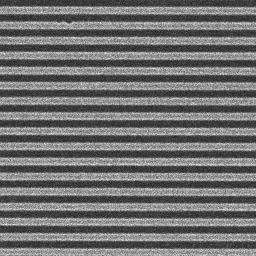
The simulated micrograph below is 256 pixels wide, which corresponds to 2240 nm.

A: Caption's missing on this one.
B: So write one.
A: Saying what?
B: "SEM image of parallel lines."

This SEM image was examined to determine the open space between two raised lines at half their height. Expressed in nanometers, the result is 59.1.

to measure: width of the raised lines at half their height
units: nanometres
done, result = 66.7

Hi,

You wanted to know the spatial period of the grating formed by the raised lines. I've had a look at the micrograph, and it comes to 0.132 um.